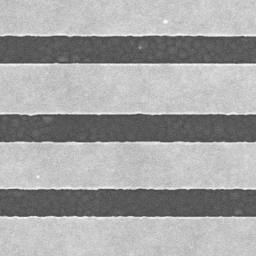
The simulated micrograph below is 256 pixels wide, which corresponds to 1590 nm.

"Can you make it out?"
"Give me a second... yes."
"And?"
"lines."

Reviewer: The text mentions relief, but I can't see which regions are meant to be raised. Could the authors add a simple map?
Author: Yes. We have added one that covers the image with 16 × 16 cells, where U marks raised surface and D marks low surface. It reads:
UUUUUUUUUUUUUUUU
UUUUUUUUUUUUUUUU
DDDDDDDDDDDDDDDD
DDDDDDDDDDDDDDDD
UUUUUUUUUUUUUUUU
UUUUUUUUUUUUUUUU
UUUUUUUUUUUUUUUU
DDDDDDDDDDDDDDDD
DDDDDDDDDDDDDDDD
UUUUUUUUUUUUUUUU
UUUUUUUUUUUUUUUU
UUUUUUUUUUUUUUUU
DDDDDDDDDDDDDDDD
DDDDDDDDDDDDDDDD
UUUUUUUUUUUUUUUU
UUUUUUUUUUUUUUUU